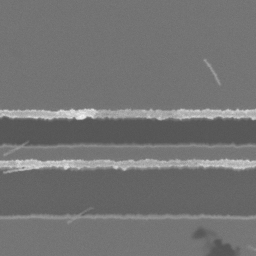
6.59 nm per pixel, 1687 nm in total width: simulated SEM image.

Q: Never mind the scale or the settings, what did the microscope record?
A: lines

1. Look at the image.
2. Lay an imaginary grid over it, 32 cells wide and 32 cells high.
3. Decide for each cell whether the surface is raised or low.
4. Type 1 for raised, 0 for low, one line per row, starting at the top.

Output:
11111111111111111111111111111111
11111111111111111111111111111111
11111111111111111111111111111111
11111111111111111111111111111111
11111111111111111111111111111111
11111111111111111111111111111111
11111111111111111111111111111111
11111111111111111111111111111111
11111111111111111111111111111111
11111111111111111111111111111111
11111111111111111111111111111111
11111111111111111111111111111111
11111111111111111111111111111111
11111111111111111111111111111111
11111111111111111111111111111111
00000000000000000000000000000000
00000000000000000000000000000000
00000000000000000000000000000000
11111111111111111111111111111111
11111111111111111111111111111111
11111111111111111111111111111111
00000000000000000000000000000000
00000000000000000000000000000000
00000000000000000000000000000000
00000000000000000000000000000000
00000000000000000000000000000000
00000000000000000000000000000000
11111111111111111111111111111111
11111111111111111111111111111111
11111111111111111111111111111111
11111111111111111111111111111111
11111111111111111111111111111111